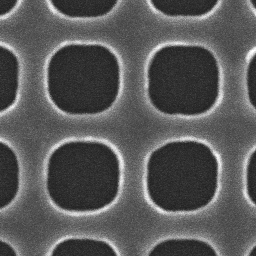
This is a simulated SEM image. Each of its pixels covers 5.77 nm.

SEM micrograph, holes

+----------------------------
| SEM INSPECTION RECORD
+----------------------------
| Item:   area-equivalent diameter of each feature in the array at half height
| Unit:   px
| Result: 74.3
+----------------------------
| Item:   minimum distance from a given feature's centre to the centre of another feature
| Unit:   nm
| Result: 558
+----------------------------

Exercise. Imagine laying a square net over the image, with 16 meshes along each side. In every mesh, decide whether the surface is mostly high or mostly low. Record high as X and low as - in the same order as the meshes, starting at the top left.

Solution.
-XXX---XXX---XXX
XXXXXXXXXXXXXXXX
XXXXXXXXXXXXXXXX
-XX----XXX---XXX
-XX----XX-----X-
-XX----XX-----X-
-XX----XXX---XXX
XXXXXXXXXXXXXXXX
XXXXXXXXXXXXXXXX
-XX----XXX---XXX
-XX----XX-----X-
-XX----XX-----X-
-XX----XXX---XXX
XXXXXXXXXXXXXXXX
XXXXXXXXXXXXXXXX
-XX----XXX---XXX